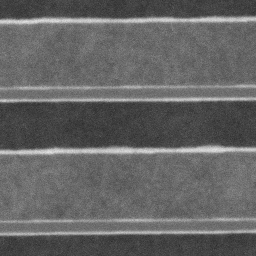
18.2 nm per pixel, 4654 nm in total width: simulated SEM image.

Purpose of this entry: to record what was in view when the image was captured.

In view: lines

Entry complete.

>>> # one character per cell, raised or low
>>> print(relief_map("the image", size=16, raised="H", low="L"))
LLLLLLLLLLLLLLLL
HHHHHHHHHHHHHHHH
HHHHHHHHHHHHHHHH
HHHHHHHHHHHHHHHH
HHHHHHHHHHHHHHHH
HHHHHHHHHHHHHHHH
LLLLLLLLLLLLLLLL
LLLLLLLLLLLLLLLL
LLLLLLLLLLLLLLLL
LLLLLLLLLLLLHHHH
HHHHHHHHHHHHHHHH
HHHHHHHHHHHHHHHH
HHHHHHHHHHHHHHHH
HHHHHHHHHHHHHHHH
HHHHHHHHHHHHHHLL
LLLLLLLLLLLLLLLL